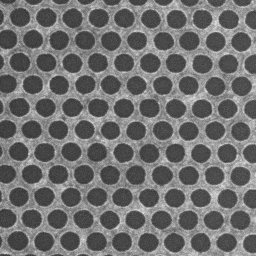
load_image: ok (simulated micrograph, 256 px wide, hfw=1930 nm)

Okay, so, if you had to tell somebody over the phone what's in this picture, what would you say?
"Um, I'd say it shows a regular array of holes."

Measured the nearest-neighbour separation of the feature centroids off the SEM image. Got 0.191 microns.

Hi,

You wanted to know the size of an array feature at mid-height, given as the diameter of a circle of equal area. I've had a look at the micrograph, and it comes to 156 nanometres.